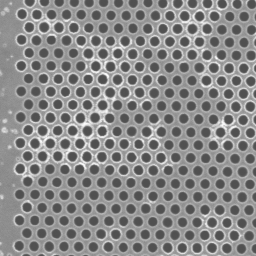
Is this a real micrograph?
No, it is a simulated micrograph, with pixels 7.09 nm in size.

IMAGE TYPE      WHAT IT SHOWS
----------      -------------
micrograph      a regular array of holes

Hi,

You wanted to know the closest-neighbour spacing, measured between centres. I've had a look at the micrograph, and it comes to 103 nanometres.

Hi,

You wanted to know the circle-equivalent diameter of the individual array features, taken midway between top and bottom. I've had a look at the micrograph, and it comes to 64 nm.